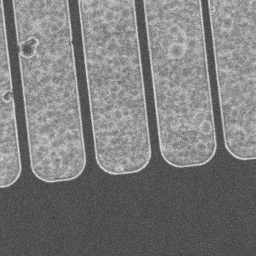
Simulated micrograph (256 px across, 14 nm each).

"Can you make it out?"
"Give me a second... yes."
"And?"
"one or a few lines or trenches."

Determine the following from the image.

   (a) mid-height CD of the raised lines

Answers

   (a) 0.167 microns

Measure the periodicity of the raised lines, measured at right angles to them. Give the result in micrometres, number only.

0.916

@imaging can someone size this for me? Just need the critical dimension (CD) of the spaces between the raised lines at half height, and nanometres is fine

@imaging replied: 756